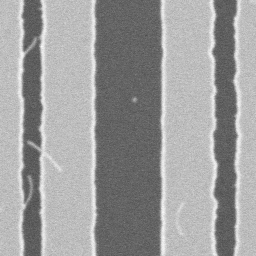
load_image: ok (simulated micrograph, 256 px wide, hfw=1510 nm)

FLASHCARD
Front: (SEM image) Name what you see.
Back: lines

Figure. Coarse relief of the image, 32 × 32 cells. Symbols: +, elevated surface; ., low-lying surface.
+++..+++++++........+++++++...++
+++..+++++++........+++++++...++
+++..+++++++........+++++++..+++
+++..+++++++........+++++++..+++
+++..+++++++........+++++++..+++
+++..+++++++........+++++++..+++
+++..+++++++........++++++...+++
+++..+++++++........+++++++..+++
+++..+++++++........+++++++...++
+++..+++++++........+++++++..+++
+++..+++++++........+++++++..+++
+++..+++++++........+++++++..+++
+++..+++++++........+++++++...++
+++..+++++++........+++++++...++
+++..+++++++........+++++++...++
+++..+++++++........+++++++..+++
+++..+++++++........+++++++...++
+++..+++++++........+++++++...++
+++..+++++++........+++++++...++
+++..+++++++........+++++++..+++
+++..+++++++........+++++++..+++
+++..+++++++........+++++++..+++
+++..+++++++........+++++++...++
+++..+++++++........+++++++...++
+++..+++++++........+++++++..+++
+++..+++++++........+++++++..+++
+++..+++++++........+++++++...++
+++..+++++++........+++++++...++
+++..+++++++........+++++++..+++
+++..+++++++........+++++++..+++
+++..+++++++........+++++++..+++
+++..+++++++........+++++++..+++